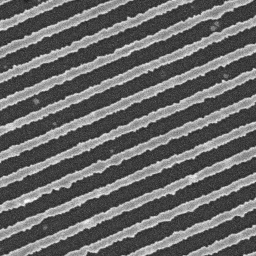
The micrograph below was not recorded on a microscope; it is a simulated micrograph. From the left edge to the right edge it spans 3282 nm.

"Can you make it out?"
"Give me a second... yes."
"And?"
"parallel lines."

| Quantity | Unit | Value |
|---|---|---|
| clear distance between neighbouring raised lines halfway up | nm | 202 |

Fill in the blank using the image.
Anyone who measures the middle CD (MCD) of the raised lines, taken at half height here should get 104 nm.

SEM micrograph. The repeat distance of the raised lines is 0.307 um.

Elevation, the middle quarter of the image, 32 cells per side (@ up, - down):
----@@@@@----------@@@@@--------
-@@@@@@----------@@@@@----------
@@@@-----------@@@@-----------@@
@@----------@@@@@----------@@@@@
----------@@@@@----------@@@@@--
--------@@@@-----------@@@@@----
-----@@@@@----------@@@@@-------
---@@@@@----------@@@@@---------
@@@@@@---------@@@@@@----------@
@@@@---------@@@@@@----------@@@
@----------@@@@@-----------@@@@-
---------@@@@@----------@@@@@---
-------@@@@----------@@@@@@-----
----@@@@@----------@@@@@--------
--@@@@@----------@@@@@----------
@@@@-----------@@@@@@---------@@
@@----------@@@@@@---------@@@@@
-----------@@@@----------@@@@@@-
--------@@@@@---------@@@@@-----
------@@@@-----------@@@@@------
---@@@@@----------@@@@@@--------
-@@@@@----------@@@@@-----------
@@@@---------@@@@@@----------@@@
------------@@@@----------@@@@@@
--------@@@@@@---------@@@@@@---
-------@@@@@---------@@@@@@-----
-----@@@@@---------@@@@@--------
--@@@@@----------@@@@@----------
@@@@@----------@@@@@----------@@
@@@----------@@@@-----------@@@@
@@---------@@@@-----------@@@@--
--------@@@@@----------@@@@@----